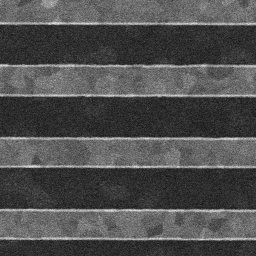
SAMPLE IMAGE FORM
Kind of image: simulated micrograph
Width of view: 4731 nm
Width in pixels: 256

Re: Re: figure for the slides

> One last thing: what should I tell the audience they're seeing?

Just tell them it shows one or a few lines or trenches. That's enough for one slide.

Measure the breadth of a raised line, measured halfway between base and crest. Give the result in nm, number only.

526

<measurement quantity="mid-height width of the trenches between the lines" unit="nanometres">804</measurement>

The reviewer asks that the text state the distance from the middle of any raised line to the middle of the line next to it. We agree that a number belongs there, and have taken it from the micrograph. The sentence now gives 1330 nm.